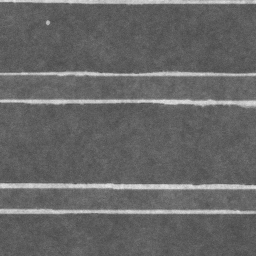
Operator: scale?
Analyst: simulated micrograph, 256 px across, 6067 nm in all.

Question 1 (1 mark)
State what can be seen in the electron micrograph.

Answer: lines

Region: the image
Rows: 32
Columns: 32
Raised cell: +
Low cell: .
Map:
................................
................................
................................
................................
................................
................................
................................
................................
................................
++++++++++++++++++++++++++++++++
++++++++++++++++++++++++++++++++
++++++++++++++++++++++++++++++++
..........++++++++++++++++++++++
................................
................................
................................
................................
................................
................................
................................
................................
................................
................................
++++++++++++++++++++++++++++++++
++++++++++++++++++++++++++++++++
++++++++++++++++++++++++++++++++
................................
................................
................................
................................
................................
................................